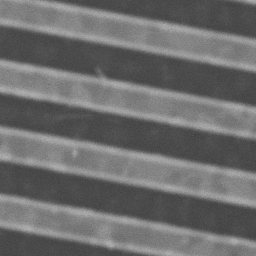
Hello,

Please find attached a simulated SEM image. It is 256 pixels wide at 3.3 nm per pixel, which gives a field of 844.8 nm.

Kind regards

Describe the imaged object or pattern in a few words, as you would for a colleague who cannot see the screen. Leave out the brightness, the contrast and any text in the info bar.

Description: one or a few lines or trenches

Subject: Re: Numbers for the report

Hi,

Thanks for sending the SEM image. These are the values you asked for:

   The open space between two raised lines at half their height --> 130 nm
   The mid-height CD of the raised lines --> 27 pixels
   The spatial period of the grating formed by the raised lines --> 0.219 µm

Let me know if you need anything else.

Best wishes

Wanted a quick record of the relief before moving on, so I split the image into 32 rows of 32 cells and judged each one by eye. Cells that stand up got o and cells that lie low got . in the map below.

oooooo..........................
ooooooooooo.....................
ooooooooooooooooo...............
....oooooooooooooooooo..........
..........oooooooooooooooooo....
...............ooooooooooooooooo
.....................ooooooooooo
..........................oooooo
oooo...........................o
oooooooooo......................
ooooooooooooooo.................
..oooooooooooooooooo............
.......oooooooooooooooooo.......
.............ooooooooooooooooo..
..................oooooooooooooo
.......................ooooooooo
oo...........................ooo
oooooooo........................
ooooooooooooo...................
oooooooooooooooooo..............
.....oooooooooooooooooo.........
..........ooooooooooooooooooo...
...............ooooooooooooooooo
.....................ooooooooooo
..........................oooooo
ooooo...........................
oooooooooo......................
oooooooooooooooo................
...oooooooooooooooooo...........
........oooooooooooooooooo......
.............oooooooooooooooooo.
...................ooooooooooooo